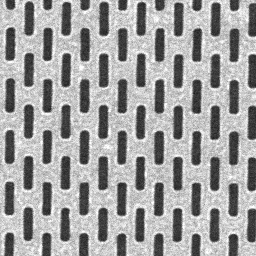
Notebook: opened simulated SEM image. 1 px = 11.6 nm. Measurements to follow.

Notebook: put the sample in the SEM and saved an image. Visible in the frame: a regular array of holes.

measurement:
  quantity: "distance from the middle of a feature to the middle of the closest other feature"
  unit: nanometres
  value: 365